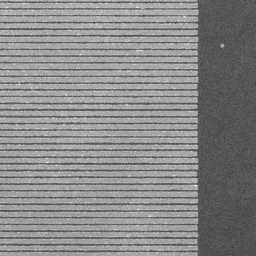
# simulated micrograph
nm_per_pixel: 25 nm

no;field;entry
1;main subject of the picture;parallel lines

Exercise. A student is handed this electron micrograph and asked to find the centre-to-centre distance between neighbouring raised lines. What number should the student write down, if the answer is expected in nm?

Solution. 168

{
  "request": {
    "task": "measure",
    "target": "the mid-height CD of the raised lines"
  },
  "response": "0.109 um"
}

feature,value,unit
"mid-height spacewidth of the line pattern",2.37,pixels